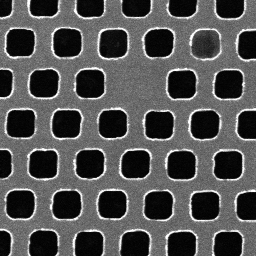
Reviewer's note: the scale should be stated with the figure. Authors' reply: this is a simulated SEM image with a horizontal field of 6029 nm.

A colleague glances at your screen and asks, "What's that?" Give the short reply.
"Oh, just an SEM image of a regular array of holes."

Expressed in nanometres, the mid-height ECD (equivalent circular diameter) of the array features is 715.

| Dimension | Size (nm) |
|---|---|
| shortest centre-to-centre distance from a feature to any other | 1080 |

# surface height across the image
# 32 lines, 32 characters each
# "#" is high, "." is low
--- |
..##...###...##....##....##...##
.###...###...##....##...###...##
################################
################################
#...###...###...##....###..###..
#...###...##....##....###..###..
#...###...##....##...####..###..
################################
################################
..##...###...########...###...##
..##...##....########....##...##
.###...###...########...###...##
################################
################################
#...###...##....##....##...###..
#...###...##....##....##...###..
#...###...##....##....##...###..
################################
################################
.###...###...##....##...###...##
.###...###...##....##....##...##
.###...###...##....##...###...##
######################.#########
################################
#...###...##....##...###...###..
#...###...##....##....##...##...
#...###...##....##...###...###..
###################.#####.######
################################
.###...###...##....##...###...##
.###...##....##....##....##...##
.###...##....##....##...###...##